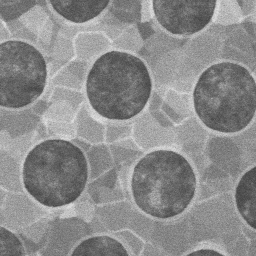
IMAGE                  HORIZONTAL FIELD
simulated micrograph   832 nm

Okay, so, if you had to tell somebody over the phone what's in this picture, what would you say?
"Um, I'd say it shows holes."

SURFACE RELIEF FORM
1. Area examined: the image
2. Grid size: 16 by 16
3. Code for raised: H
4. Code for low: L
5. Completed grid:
HHHLLLLHHHLLLLHH
HHHHHHHHHHLLLHHH
HHHHHHHHHHHHHHHH
LLLHHHLLLHHHHHHH
LLLHHHLLLHHHHLLL
LLLHHLLLLHHHLLLL
LLHHHHLLLHHHLLLL
HHHHHHHLHHHHLLLL
HHHHHHHHHHHHHHHH
HHLLLHHHHLLHHHHH
HLLLLLHHLLLLHHHH
HLLLLHHHLLLLHHHL
HHLLLHHHLLLLHHHL
HHHHHHHHHLLHHHHL
LHHHHHHHHHHHHHHH
LHHHHLLLHHHHHHHH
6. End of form